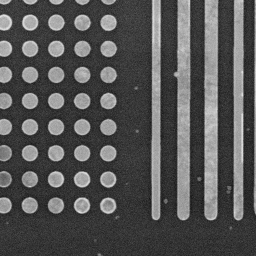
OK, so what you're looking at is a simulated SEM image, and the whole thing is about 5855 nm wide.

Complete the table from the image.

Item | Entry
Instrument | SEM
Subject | groups of lines, slits or small figures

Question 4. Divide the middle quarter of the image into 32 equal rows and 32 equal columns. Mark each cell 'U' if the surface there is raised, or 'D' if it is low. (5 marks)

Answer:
DDDDDDDDDDDDDDDDDDDDDDUUDDDDDUUD
DDDUUUDDDDUUDDDDDDDDDDUUDDDDDUUD
DDDUUUDDDUUUUDDDDDDDDDUUDDDDUUUD
DDDUUUDDDUUUUDDDDDDDDDUUDDDDDUUD
DDDDUDDDDDUUDDDDDDDDDDUUDDDDDUUD
DDDDDDDDDDDDDDDDDDDDDDUUDDDDDUUD
DDDDDDDDDDDDDDDDDDDDDDUUDDDDDUUD
DDDDUDDDDDUUDDDDDDDDDDUUDDDDDUUD
DDDUUUDDDUUUUDDDDDDDDDUUDDDDDUUD
DDDUUUDDDUUUUDDDDDDDDDUUDDDDDUUD
DDDUUUDDDDUUUDDDDDDDDDUUDDDDDUUD
DDDDDDDDDDDDDDDDDDDDDDUUDDDDDUUD
DDDDDDDDDDDDDDDDDDDDDDUUDDDDDUUD
DDDDDDDDDDDDDDDDDDDDDDUUDDDDDUUD
DDDUUUDDDDUUDDDDDDDDDDUUDDDDDUUD
DDDUUUDDDUUUUDDDDDDDDDUUDDDDDUUD
DDDUUUDDDUUUUDDDDDDDDDUUDDDDDUUD
DDDDUDDDDDUUDDDDDDDDDDUUDDDDDUUD
DDDDDDDDDDDDDDDDDDDDDDUUDDDDDUUD
DDDDDDDDDDDDDDDDDDDDDDUUDDDDDUUD
DDDDUDDDDDUUDDDDDDDDDDUUDDDDDUUD
DDDUUUDDDUUUUDDDDDDDDDUUDDDDDUUD
DDDUUUDDDUUUUDDDDDDDDDUUDDDDUUUD
DDDUUUDDDDUUDDDDDDDDDDUUDDDDUUUD
DDDDDDDDDDDDDDDDDDDDDDUUDDDDUUUD
DDDDDDDDDDDDDDDDDDDDDDUUDDDDUUUD
DDDDDDDDDDDDDDDDDDDDDDUUDDDDUUUD
DDDUUUDDDDUUDDDDDDDDDDUUDDDDUUUD
DDDUUUDDDUUUUDDDDDDDDDUUDDDDUUUD
DDDUUUDDDUUUUDDDDDDDDDUUDDDDUUUD
DDDDUDDDDDUUDDDDDDDDDDUUDDDDUUUD
DDDDDDDDDDDDDDDDDDDDDDUUDDDDUUUD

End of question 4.